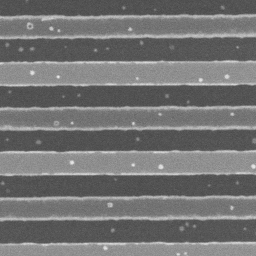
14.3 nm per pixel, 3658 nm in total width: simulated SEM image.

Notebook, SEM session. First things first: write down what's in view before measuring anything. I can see lines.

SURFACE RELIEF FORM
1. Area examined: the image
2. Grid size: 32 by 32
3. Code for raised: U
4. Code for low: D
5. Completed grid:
DDDDDDDDDDDDDDDDDDDDDDDDDDDDDDDD
DDDDDDDDDDDDDDDDDDDDDDDDDDDDDDDD
UUUUUUUUUUUUUUUUUUUUUUUUUUUUUUUU
UUUUUUUUUUUUUUUUUUUUUUUUUUUUUUUU
UUUUUUUUUUUUUUUUUUUUUUUUUUUUUUUU
DDDDDDDDDDDDDDDDDDDDDDDDDDDDDDDD
DDDDDDDDDDDDDDDDDDDDDDDDDDDDDDDD
DDDDDDDDDDDDDDDDDDDDDDDDDDDDDDDD
UUUUUUUUUUUUUUUUUUUUUUUUUUUUUUUU
UUUUUUUUUUUUUUUUUUUUUUUUUUUUUUUU
UUUUUUUUUUUUUUUUUUUUUUUUUUUUUUDU
DDDDDDDDDDDDDDDDDDDDDDDDDDDDDDDD
DDDDDDDDDDDDDDDDDDDDDDDDDDDDDDDD
DDDDUDUUUUUUUUDUUUUUUUUUUUUUUUUU
UUUUUUUUUUUUUUUUUUUUUUUUUUUUUUUU
UUUUUUUUUUUUUUUUUUUUUUUUUUUUUUUU
DDDDDDDDDDDDDDDDDDDDDDDDDDDDDDDD
DDDDDDDDDDDDDDDDDDDDDDDDDDDDDDDD
DDDDDDDDDDDDDDDDDDDDDDDDDDDDDDDD
UUUUUUUUUUUUUUUUUUUUUUUUUUUUUUUU
UUUUUUUUUUUUUUUUUUUUUUUUUUUUUUUU
UUUUUUUUUUUUUUUUUUUUUUUUUUUUUUUU
DDDDDDDDDDDDDDDDDDDDDDDDDDDDDDDD
DDDDDDDDDDDDDDDDDDDDDDDDDDDDDDDD
DDDDDDDDDDDDDDDDDDDDDDDDDDDDDDDD
UUUUUUUUUUUUUUUUUUUUUUUUUUUUUUUU
UUUUUUUUUUUUUUUUUUUUUUUUUUUUUUUU
DDDDDDDDDDDDDDDDDDDDDDDDDDDDDDDD
DDDDDDDDDDDDDDDDDDDDDDDDDDDDDDDD
DDDDDDDDDDDDDDDDDDDDDDDDDDDDDDDD
DDUUUDUUUUUUUUUUUUUUUUUUUUUUUUUU
UUUUUUUUUUUUUUUUUUUUUUUUUUUUUUUU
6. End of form